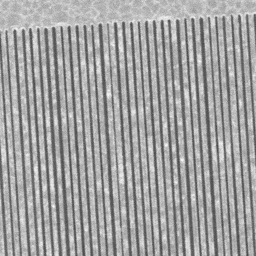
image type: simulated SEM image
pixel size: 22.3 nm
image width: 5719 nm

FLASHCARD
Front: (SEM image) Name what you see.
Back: parallel lines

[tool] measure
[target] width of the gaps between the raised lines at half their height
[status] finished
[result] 69.6 nanometres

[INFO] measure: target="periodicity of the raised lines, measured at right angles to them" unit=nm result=173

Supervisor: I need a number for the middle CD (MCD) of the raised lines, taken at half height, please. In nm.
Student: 106